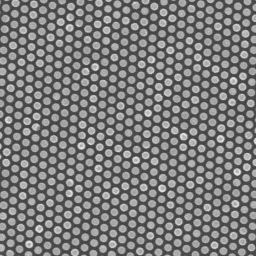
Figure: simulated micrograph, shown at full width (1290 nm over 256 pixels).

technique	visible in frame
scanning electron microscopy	a regular array of raised bodies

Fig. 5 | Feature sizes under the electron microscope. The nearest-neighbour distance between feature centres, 52.8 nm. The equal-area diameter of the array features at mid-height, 0.0373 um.